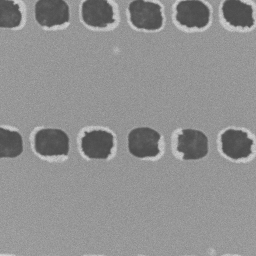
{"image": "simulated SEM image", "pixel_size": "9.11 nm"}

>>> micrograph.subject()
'holes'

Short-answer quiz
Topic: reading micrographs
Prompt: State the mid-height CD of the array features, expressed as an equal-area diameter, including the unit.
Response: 0.285 microns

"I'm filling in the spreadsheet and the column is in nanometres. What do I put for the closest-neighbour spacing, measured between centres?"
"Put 415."